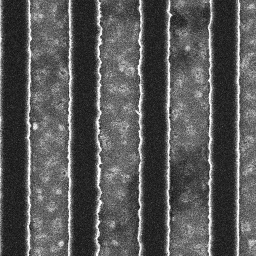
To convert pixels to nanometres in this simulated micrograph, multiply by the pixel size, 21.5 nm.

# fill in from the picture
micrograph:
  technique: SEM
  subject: one or a few lines or trenches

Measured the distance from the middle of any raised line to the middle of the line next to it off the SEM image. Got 1510 nanometers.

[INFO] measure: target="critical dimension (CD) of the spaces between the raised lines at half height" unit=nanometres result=877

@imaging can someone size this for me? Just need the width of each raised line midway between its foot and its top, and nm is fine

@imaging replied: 622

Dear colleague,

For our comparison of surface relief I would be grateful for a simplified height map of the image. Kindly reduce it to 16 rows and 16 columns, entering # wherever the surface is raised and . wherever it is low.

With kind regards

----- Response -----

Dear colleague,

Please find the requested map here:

##..##...##..##.
##..##...##..##.
##..##...##..##.
##..##...##..##.
##..##...##..##.
##..##...##..##.
##..##...##..##.
##..##...##..##.
##..##...##..##.
##..##...##..##.
##..##...##..##.
##..##...##..##.
##..##...##..##.
##..##...##..##.
##..##...##..##.
##..##...##..##.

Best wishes